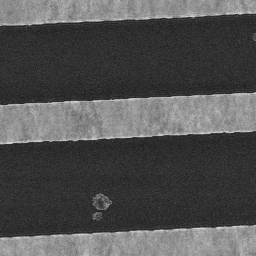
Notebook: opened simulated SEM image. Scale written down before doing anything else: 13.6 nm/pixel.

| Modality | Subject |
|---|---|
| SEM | lines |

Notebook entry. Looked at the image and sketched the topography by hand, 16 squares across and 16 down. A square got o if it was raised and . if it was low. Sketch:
oooooooooooooooo
oo..............
................
................
................
................
.ooooooooooooooo
oooooooooooooooo
oooooooooo......
................
................
................
................
................
........oooooooo
oooooooooooooooo